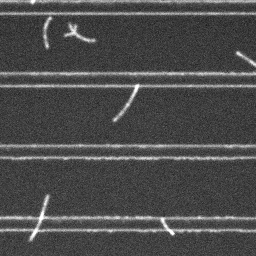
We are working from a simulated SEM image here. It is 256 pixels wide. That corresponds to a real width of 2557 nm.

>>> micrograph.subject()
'lines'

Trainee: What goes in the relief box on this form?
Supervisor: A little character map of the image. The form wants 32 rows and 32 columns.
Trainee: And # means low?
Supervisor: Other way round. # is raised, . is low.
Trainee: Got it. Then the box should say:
################################
################################
................................
................................
................................
................................
................................
................................
................................
################################
################################
................................
................................
................................
................................
................................
................................
................................
################################
################################
................................
................................
................................
................................
................................
................................
................................
################################
################################
................................
................................
................................